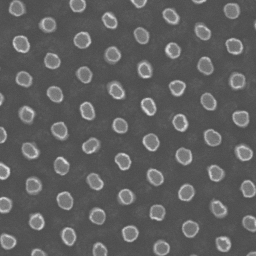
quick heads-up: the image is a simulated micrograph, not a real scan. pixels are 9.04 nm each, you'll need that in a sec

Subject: a regular array of raised bodies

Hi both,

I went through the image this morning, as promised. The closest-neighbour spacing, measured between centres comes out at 310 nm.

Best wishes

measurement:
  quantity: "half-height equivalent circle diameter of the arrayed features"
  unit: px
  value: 16